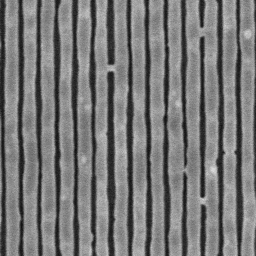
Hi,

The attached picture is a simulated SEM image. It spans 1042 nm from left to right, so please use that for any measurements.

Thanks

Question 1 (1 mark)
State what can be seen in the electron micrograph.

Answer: parallel lines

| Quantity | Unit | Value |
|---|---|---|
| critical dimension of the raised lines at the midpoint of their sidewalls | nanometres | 50.9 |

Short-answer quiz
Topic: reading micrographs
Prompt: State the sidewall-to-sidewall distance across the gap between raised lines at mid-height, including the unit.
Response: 23.4 nanometres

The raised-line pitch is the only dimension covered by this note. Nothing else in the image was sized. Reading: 18.1 px